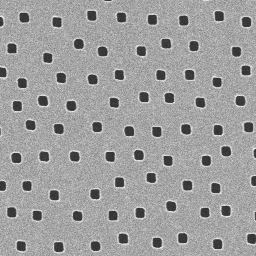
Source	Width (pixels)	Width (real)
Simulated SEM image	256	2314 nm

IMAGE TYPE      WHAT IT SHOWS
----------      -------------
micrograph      a regular array of holes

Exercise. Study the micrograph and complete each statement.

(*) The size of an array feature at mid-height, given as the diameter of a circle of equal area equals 96.5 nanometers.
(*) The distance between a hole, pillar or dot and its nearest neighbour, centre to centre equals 239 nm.